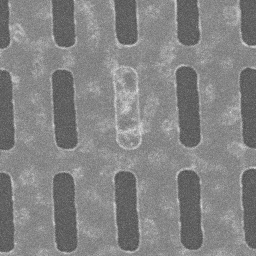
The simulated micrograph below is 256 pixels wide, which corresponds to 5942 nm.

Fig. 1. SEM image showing holes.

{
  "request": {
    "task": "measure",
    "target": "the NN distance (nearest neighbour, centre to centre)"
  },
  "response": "1.43 um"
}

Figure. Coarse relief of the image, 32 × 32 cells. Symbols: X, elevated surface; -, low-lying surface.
-XXXXX---XXXXX---XXXXX---XXXXX--
-XXXXXX--XXXXX---XXXXX---XXXXX--
-XXXXXX--XXXXX---XXXXX---XXXXX--
-XXXXXX--XXXXX---XXXXX---XXXXX--
-XXXXXX---XXXX---XXXXX---XXXXX--
-XXXXXX--XXXXXX--XXXXXX--XXXXXX-
XXXXXXXXXXXXXXXXXXXXXXXXXXXXXXXX
XXXXXXXXXXXXXXXXXXXXXXXXXXXXXXXX
XXXXXXXXXXXXXXXXXXXXXX--XXXXXXX-
-XXXXX---XXXXX---XXXXX---XXXXX--
--XXXX---XXXXX---XXXXX---XXXXX--
--XXXX---XXXXX---XXXXX---XXXXX--
--XXXXX--XXXXX---XXXXX---XXXXX--
--XXXXX--XXXXX---XXXXX---XXXXX--
--XXXXX---XXXX---XXXXX---XXXXX--
--XXXXX---XXXX---XXXXX---XXXXX--
--XXXXX---XXXXX--XXXXX---XXXXX--
--XXXXX---XXXXX--XXXXX---XXXXX--
--XXXXXX-XXXXXXX-XXXXXX-XXXXXXX-
XXXXXXXXXXXXXXXXXXXXXXXXXXXXXXXX
XXXXXXXXXXXXXXXXXXXXXXXXXXXXXXXX
XXXXXXXXXXXXXXX-XXXXXX--XXXXXXX-
-XXXXXX--XXXXX---XXXXX---XXXXX--
--XXXX---XXXXX---XXXXX---XXXXX--
--XXXXX--XXXXX---XXXXX---XXXXX--
--XXXXX--XXXXX---XXXXX---XXXXX--
--XXXXX---XXXX---XXXXX---XXXXX--
--XXXXX---XXXX---XXXXX---XXXXX--
--XXXXX---XXXXX--XXXXXX--XXXXX--
--XXXXX---XXXXX--XXXXX---XXXXXX-
--XXXXX---XXXXX--XXXXXX--XXXXXX-
-XXXXXXX-XXXXXXXXXXXXXXXXXXXXXXX